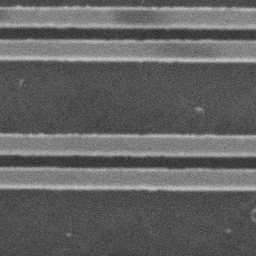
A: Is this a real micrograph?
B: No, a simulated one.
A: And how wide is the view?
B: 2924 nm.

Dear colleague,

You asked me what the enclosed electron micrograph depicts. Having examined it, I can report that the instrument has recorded lines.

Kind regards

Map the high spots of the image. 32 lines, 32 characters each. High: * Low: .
................................
********************************
********************************
...........................*****
................................
********************************
********************************
..............*.****************
................................
................................
................................
................................
................................
................................
................................
................................
................................
********************************
********************************
....................**.*********
................................
********************************
********************************
.*******************************
................................
................................
................................
................................
................................
................................
................................
................................